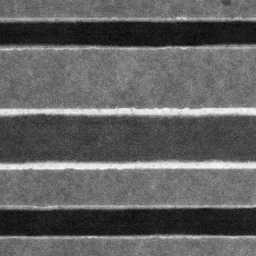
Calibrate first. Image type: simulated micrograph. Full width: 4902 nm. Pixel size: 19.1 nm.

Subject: lines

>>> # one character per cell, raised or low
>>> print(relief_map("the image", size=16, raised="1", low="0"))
1111111111111111
0000000000000000
0000000000000000
1111111111111111
1111111111111111
1111111111111111
1111111111111111
0000000000000000
0000000000000000
0000000000000000
0001100111111111
1111111111111111
1111111111111111
0000000000000000
0000000000000000
1111111111111111